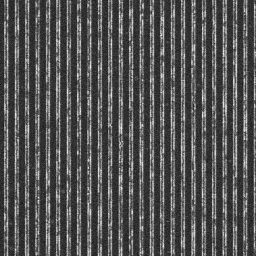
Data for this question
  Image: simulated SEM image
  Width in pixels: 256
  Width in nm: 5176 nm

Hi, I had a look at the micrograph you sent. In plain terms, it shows parallel lines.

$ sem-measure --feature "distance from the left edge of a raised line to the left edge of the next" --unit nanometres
210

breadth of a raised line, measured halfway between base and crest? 68.2 nm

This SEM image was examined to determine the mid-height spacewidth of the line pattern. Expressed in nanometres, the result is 147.